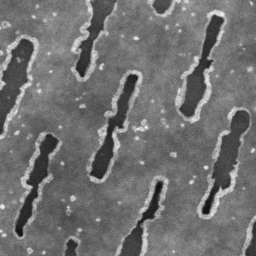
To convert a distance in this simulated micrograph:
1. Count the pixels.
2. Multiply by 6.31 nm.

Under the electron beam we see holes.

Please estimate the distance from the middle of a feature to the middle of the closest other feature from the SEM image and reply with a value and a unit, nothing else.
580 nm